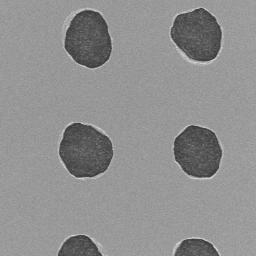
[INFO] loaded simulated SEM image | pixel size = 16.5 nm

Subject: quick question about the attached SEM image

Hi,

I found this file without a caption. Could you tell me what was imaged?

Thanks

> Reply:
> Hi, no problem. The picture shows holes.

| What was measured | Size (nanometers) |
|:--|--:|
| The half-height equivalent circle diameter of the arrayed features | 858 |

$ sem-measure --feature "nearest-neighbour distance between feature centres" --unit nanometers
1820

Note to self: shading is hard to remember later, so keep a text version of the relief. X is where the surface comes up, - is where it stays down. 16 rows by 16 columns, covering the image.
XXXXXXXXXXXXXXXX
XXXX---XXXX---XX
XXXX---XXXX---XX
XXXX---XXXXX-XXX
XXXXXXXXXXXXXXXX
XXXXXXXXXXXXXXXX
XXXXXXXXXXXXXXXX
XXXXXXXXXXXXXXXX
XXXX---XXXX--XXX
XXXX---XXXX---XX
XXXX---XXXX---XX
XXXXXXXXXXXXXXXX
XXXXXXXXXXXXXXXX
XXXXXXXXXXXXXXXX
XXXXXXXXXXXXXXXX
XXXX--XXXXX--XXX